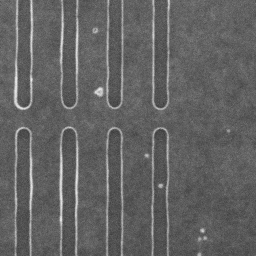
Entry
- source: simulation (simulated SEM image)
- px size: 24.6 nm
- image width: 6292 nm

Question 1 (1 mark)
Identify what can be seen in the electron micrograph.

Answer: groups of lines, slits or small figures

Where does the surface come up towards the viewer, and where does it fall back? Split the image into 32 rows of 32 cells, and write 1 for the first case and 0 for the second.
11001111001111011110011111111111
11001111001110011110011111111111
11001111001111011110011111111111
11001111001110011110011111111111
11001111001110011110011111111111
11001111001110011110011111111111
11001111001110011110011111111111
11001111001110011110011111111111
11001111001110011110011111111111
11001111001110011110011111111111
11001111001110011110011111111111
11001111001110011110011111111111
11001111001110011110011111111111
11111111111111111111111111111111
11111111111111111111111111111111
11111111111111111111111111111111
11001111011111011110011111111111
11001111001110011110011111111111
11001111001110011110011111111111
11001111001110011110011111111111
11001111001110011110011111111111
11001111001110011110011111111111
11001111001110011110011111111111
11001111001110011110011111111111
11001111001110011110011111111111
11001111001110011110011111111111
11001111001110011110011111111111
11001111001110011110011111111111
11001111001110011110011111111111
11001111001110011110011111111111
11001111001110011110011111111111
11001111001110011110011111111111